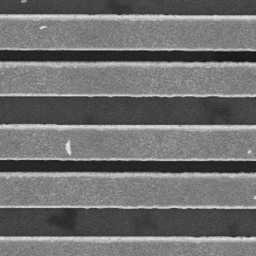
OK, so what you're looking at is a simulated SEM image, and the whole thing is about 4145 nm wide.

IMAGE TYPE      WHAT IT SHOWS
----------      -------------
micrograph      lines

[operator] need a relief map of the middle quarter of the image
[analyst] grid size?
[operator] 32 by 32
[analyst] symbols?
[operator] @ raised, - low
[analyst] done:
@@@@@@@@@@@@@@@@@@@@@@@@@@@@@@@@
@@@@@@@@@@@@@@@@@@@@@@@@@@@@@@@@
@@@@@@@@@@@@@@@@@@@@@@@@@@@@@@@@
@@@@@@@@@@@@@@@@@@@@@@@@@@@@@@@@
@@@@@@@@@@@@@@@@@@@@@@@@@@@@@@@@
@@@@@@@@@@@@@@@@@@@@@@@@@@@@@@@@
@@@@@@@@@@@@@@@@@@@@@@@@@@@@@@@@
@@@@@@@@@@@@@@@@@@@@@@@@@@@@@@@@
--------------------------------
--------------------------------
--------------------------------
--------------------------------
--------------------------------
--------------------------------
--------------------------------
@@@@@@@@@@@@@@@@@@@@@@@@@@@@@@@@
@@@@@@@@@@@@@@@@@@@@@@@@@@@@@@@@
@@@@@@@@@@@@@@@@@@@@@@@@@@@@@@@@
@@@@@@@@@@@@@@@@@@@@@@@@@@@@@@@@
@@@@@@@@@@@@@@@@@@@@@@@@@@@@@@@@
@@@@@@@@@@@@@@@@@@@@@@@@@@@@@@@@
@@@@@@@@@@@@@@@@@@@@@@@@@@@@@@@@
@@@@@@@@@@@@@@@@@@@@@@@@@@@@@@@@
@@@@@@@@@@@@@@@@@@@@@@@@@@@@@@@@
--------------------------------
--------------------------------
--------------------------------
@@@@@@@@@@@@@@@@@@@@@@@@@@@@@@@@
@@@@@@@@@@@@@@@@@@@@@@@@@@@@@@@@
@@@@@@@@@@@@@@@@@@@@@@@@@@@@@@@@
@@@@@@@@@@@@@@@@@@@@@@@@@@@@@@@@
@@@@@@@@@@@@@@@@@@@@@@@@@@@@@@@@